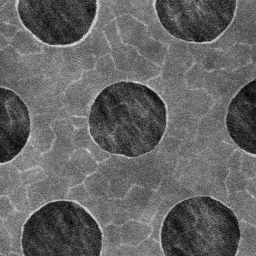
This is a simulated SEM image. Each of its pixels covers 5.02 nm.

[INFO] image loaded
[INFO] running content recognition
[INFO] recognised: holes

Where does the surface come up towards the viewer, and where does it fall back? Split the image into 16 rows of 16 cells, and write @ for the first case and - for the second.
@-----@@@@-----@
@-----@@@@----@@
@@---@@@@@@--@@@
@@@@@@@@@@@@@@@@
@@@@@@@@@@@@@@@@
@@@@@@@--@@@@@@-
--@@@@----@@@@--
--@@@@----@@@@--
--@@@@----@@@@--
-@@@@@@--@@@@@@-
@@@@@@@@@@@@@@@@
@@@@@@@@@@@@@@@@
@@@@@@@@@@@@-@@@
@@----@@@@-----@
@-----@@@@-----@
@-----@@@@-----@